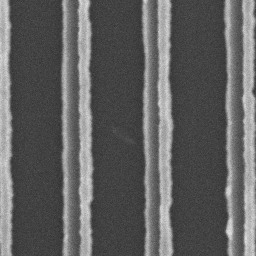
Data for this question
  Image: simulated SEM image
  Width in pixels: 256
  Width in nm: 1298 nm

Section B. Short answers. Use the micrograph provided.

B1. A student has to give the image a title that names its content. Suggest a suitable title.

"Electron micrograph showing lines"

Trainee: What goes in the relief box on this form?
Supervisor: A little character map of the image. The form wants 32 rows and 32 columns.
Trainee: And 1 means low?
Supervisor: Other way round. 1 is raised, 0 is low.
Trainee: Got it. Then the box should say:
10000000111000000011100000001111
10000000111000000011100000001111
10000000111000000011100000001111
10000000111000000011100000001111
10000000111000000011100000001111
10000000111000000011100000000111
10000000111000000011100000000111
10000000111000000011100000000111
10000000111000000011100000000111
10000000111000000011100000000111
10000000111000000011100000000111
10000000111000000011100000000110
10000000111000000011100000000111
10000000111000000011100000000111
10000000111000000011100000000111
10000000111000000011100000000111
10000000111000000011100000000111
10000000111000000011100000000111
10000000111000000011100000000111
10000000111000000011100000000111
10000000111000000011100000000111
10000000111000000011100000000111
10000000111000000011100000000111
10000000111000000011100000001111
10000000111000000011100000001111
10000000111000000011100000000111
10000000111000000011100000000111
10000000111000000011100000000111
10000000111000000011100000001111
10000000111000000011100000000111
10000000111000000011100000000111
10000000111000000011100000000111